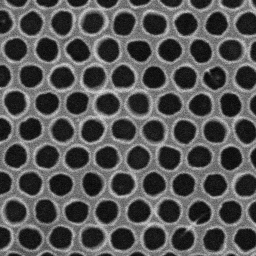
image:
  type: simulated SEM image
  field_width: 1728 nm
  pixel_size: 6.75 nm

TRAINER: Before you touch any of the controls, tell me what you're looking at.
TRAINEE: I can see a regular array of holes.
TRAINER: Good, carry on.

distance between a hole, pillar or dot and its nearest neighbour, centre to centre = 202 nm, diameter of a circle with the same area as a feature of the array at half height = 159 nanometres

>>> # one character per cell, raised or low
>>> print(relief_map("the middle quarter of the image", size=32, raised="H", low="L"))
HHHHHHHHHHHHHHLLHHHHHHLHHHHHHHHH
LLHHHLLLLLHHHLLLLHHHLLLLLHHHLLLL
LLHHHLLLLLLHLLLLLHHHLLLLLHHLLLLL
LLLHHLLLLLLHLLLLLLHHLLLLLLHLLLLL
LLLHHLLLLLHHLLLLLLHHLLLLLHHHLLLL
LLHHHLLLLLHHHLLLLHHHLLLLLHHHLLLL
HHHHHHHLHHHHHHHHHHHHHHHHHHHHHHLH
HHLLLHHHHHLLHHHHHLLLLHHHHHLLHHHH
HLLLLLHHLLLLLLHHLLLLLLHHLLLLLHHH
HLLLLLHHLLLLLLHHLLLLLLHLLLLLLHHL
LLLLLLHHLLLLLLHHLLLLLLHLLLLLLHHL
HLLLLLHHLLLLLLHHLLLLLLHHLLLLLHHL
HHLLHHHHHLLLLHHHHLLLLHHHHLLHHHHH
HHHHHHHHHHHHHHHHHHHHHHHHHHHHHHHH
LHHHHLLLLHHHHLLLLHHHHLLLLHHHLLLL
LLHHHLLLLLHHLLLLLLHHLLLLLHHHLLLL
LLLHLLLLLLHHLLLLLLHLLLLLLHHLLLLL
LLHHLLLLLLHHLLLLLLHHLLLLLHHLLLLL
LLHHLLLLLHHHHLLLLHHHLLLLLHHHLLLL
LHHHHHLHHHHHHHHHHHHHHLLLHHHHLLLL
HHHHHHHHHHHHHHHHHHLHHHHHHLHHHHHH
HLLLLHHHHLLLLHHHLLLLLHHHLLLLHHHH
LLLLLLHHLLLLLLHHLLLLLLHLLLLLLHHL
LLLLLLHHLLLLLLHHLLLLLLHLLLLLLHHL
LLLLLLHHLLLLLLHHLLLLLHHLLLLLLHHL
HLLLLHHHHLLLLHHHLLLLLHHHLLLLHHHH
HHHHHHHHHHLHHHHHHHLHHHHHHHLHHHHH
HHHHHLLLLHHHHLLLHHHHHLLLHHHHHLLH
LLHHHLLLLLHHLLLLLHHHLLLLLHHHLLLL
LLHHHLLLLLHHLLLLLLHHLLLLLHHLLLLL
LLHHHLLLLLHHLLLLLLHHLLLLLLHLLLLL
LLHHHLLLLHHHLLLLLHHHLLLLLHHLLLLL